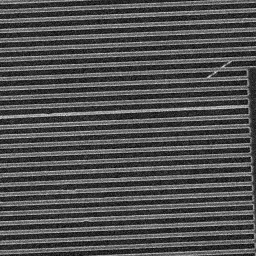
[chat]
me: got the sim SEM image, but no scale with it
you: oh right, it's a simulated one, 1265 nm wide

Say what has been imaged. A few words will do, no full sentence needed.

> parallel lines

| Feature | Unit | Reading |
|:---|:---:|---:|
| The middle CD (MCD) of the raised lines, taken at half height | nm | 20.4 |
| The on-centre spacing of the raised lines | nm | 47.5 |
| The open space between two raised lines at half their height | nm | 29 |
